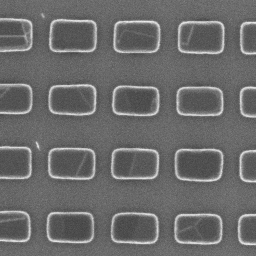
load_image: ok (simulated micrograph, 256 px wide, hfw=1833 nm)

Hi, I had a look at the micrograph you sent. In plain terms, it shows wiring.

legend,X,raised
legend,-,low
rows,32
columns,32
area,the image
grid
--------------------------------
--------------------------------
XXX----XX-----------------------
XXXX--XXXXXX--XXXXXX--XXXXXX--XX
XXXX--XXXXXX--XXXXXX--XXXXXX--XX
XXXX--XXXXXX--XXXXXX--XXXXXX--XX
---------------XXXX----XXXX---XX
--------------------------------
--------------------------------
--------------------------------
--------------------------------
XXXX--XXXXXX--XXXXXX--XXXXXX--XX
XXXX--XXXXXX--XXXXXX--XXXXXX--XX
XXXX--XXXXXX--XXXXXX--XXXXXX--XX
-------------------------------X
--------------------------------
--------------------------------
--------------------------------
XXX-----------------------------
XXXX--XXXXXX--XXXXXX--XXXXXX--XX
XXXX--XXXXXX--XXXXXX--XXXXXX--XX
XXXX--XXXXXX--XXXXXX--XXXXXX--XX
-----------------------XXXX---XX
--------------------------------
--------------------------------
--------------------------------
XXX-----------------------------
XXXX--XXXXXX--XXXXXX--XXXXXX--XX
XXXX--XXXXXX--XXXXXX--XXXXXX--XX
XXXX--XXXXXX--XXXXXX--XXXXXX--XX
--------------------------------
--------------------------------